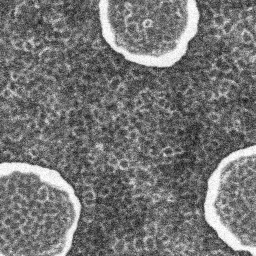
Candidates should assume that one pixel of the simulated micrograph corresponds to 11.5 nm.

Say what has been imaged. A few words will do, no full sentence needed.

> raised bodies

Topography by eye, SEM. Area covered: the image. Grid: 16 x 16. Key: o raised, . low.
......oooooo....
.......ooooo....
.......ooooo....
........ooo.....
................
................
................
................
................
...............o
oo............oo
oooo.........ooo
ooooo........ooo
ooooo........ooo
oooo..........oo
oooo...........o